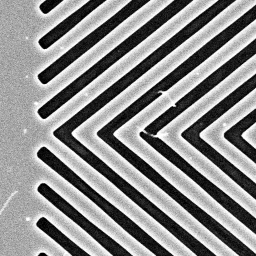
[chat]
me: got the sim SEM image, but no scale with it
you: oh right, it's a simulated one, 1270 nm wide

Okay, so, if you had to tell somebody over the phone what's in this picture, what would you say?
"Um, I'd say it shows groups of lines, slits or small figures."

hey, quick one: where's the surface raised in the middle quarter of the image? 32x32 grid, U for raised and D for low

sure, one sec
DUUUUUUDDDDDUUUUUUDDDDDUUUUUUDDD
UUUUUUDDDDDUUUUUUDDDDUUUUUUDDDDD
UUUUUDDDDUUUUUUDDDDDUUUUUUDDDDDU
UUUDDDDDUUUUUUDDDDDUUUUUUDDDDDUU
UUDDDDDUUUUUUDDDDDUUUUUUDDDDDUUU
UDDDDDUUUUUUDDDDUUUUUUDDDDDUUUUU
DDDDDUUUUUDDDDDUUUUUUDDDDDUUUUUU
DDDUUUUUUDDDDDUUUUUUDDDDUUUUUUUD
DDUUUUUUDDDDDUUUUUUDDDDDUUUUUUDD
DUUUUUUDDDDUUUUUUUDDDDUUUUUUDDDD
UUUUUUDDDDUUUUUUDDDDDUUUUUUDDDDD
UUUUDDDDDUUUUUUDDDDUUUUUUUDDDDUU
UUUDDDDUUUUUUDDDDDUUUUUUDDDDDUUU
UUDDDDUUUUUUDDDDDUUUUUUDDDDDUUUU
DDDDDUUUUUUDDDDDUUUUUUDDDDDUUUUU
DDDDUUUUUUDDDDUUUUUUUDDDDUUUUUUD
DDDUUUUUUDDDDUUUUUUUDDDDUUUUUUDD
DDUUUUUUDDDDUUUUUUUDDDDUUUUUUDDD
DDDUUUUUUDDDDUUUUUUDDDDDUUUUUUDD
DDDDUUUUUUDDDDUUUUUUUDDDDUUUUUUD
UDDDDUUUUUUDDDDDUUUUUUDDDDUUUUUU
UUDDDDDUUUUUUDDDDUUUUUUDDDDDUUUU
UUUDDDDDUUUUUUDDDDUUUUUUDDDDDUUU
UUUUDDDDDUUUUUUDDDDUUUUUUDDDDDUU
UUUUUUDDDDUUUUUUDDDDUUUUUUUDDDDU
DUUUUUUDDDDUUUUUUDDDDDUUUUUUDDDD
DDUUUUUUDDDDUUUUUUDDDDDUUUUUUDDD
DDDUUUUUUDDDDUUUUUUUDDDDUUUUUUDD
DDDDUUUUUUDDDDDUUUUUUDDDDUUUUUUU
UDDDDUUUUUUUDDDDUUUUUUDDDDUUUUUU
UUDDDDDUUUUUUDDDDUUUUUUDDDDUUUUU
UUUUDDDUUUUUUUDDDDUUUUUUDDDDDUUU